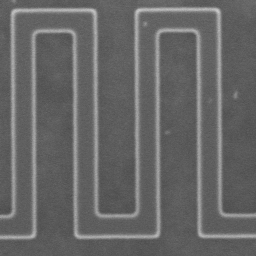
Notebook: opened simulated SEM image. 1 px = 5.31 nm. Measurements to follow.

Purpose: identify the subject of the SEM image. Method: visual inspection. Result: groups of lines, slits or small figures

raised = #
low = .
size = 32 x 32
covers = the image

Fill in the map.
................................
..##########.....##########.....
..##########.....##########.....
..##########.....##########.....
..##.....###.....###.....##.....
..##.....###.....###.....##.....
..##.....###.....###.....##.....
..##.....###.....###.....##.....
..##.....###.....###.....##.....
..##.....###.....###.....##.....
..##.....###.....###.....##.....
..##.....###.....###.....##.....
..##.....###.....###.....##.....
..##.....###.....###.....##.....
..##.....###.....###.....##.....
..##.....###.....###.....##.....
..##.....###.....###.....##.....
..##.....###.....###.....##.....
..##.....###.....###.....##.....
..##.....###.....###.....##.....
..##.....###.....###.....###....
..##.....###.....###.....###....
..##.....###.....###.....##.....
..##.....###.....###.....###....
..##.....###.....###.....###....
..##.....###.....###.....###....
.###.....###.....###.....###....
####.....###########.....#######
####.....###########.....#######
####......#########......#####..
................................
................................